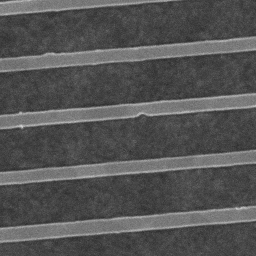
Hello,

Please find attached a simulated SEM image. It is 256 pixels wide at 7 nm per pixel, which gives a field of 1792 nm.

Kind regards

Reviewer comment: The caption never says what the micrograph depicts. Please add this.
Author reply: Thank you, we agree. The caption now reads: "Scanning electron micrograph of parallel lines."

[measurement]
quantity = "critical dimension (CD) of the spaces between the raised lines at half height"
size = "307 nanometers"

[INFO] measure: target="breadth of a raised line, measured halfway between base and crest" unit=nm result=91.6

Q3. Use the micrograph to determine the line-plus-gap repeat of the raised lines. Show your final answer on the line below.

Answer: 0.395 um